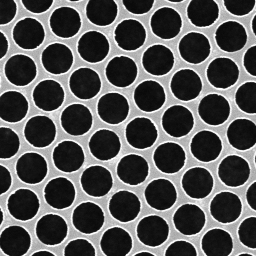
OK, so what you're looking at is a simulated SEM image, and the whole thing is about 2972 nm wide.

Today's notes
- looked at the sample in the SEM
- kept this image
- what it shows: a regular array of holes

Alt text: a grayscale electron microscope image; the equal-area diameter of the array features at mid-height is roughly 32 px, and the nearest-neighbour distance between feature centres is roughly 0.433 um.